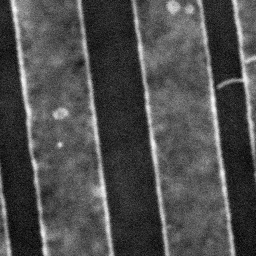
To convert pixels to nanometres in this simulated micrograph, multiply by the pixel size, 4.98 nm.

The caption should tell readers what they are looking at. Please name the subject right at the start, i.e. lines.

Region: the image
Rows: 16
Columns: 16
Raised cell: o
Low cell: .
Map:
.oooo...ooooo..o
.oooo....oooo..o
.oooo....oooo..o
.oooo....oooo..o
.ooooo...oooo..o
.ooooo...oooo..o
..oooo...oooo..o
..oooo...ooooo..
..oooo...ooooo..
..oooo....oooo..
..oooo....oooo..
..oooo....oooo..
..ooooo...oooo..
..ooooo...oooo..
...oooo...oooo..
o..oooo...ooooo.